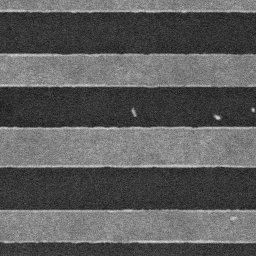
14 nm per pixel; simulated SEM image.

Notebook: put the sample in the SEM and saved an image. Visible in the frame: lines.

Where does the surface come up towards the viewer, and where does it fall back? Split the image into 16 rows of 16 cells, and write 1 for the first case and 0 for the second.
1111111111111111
0000000000000000
0000000000000000
1111111111111111
1111111111111111
0000000000000000
0000000000000000
0000000000000000
1111111111111111
1111111111111111
0000000000000000
0000000000000000
0000000000000000
1111111111111111
1111111111111111
0000000000000000